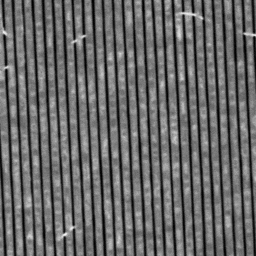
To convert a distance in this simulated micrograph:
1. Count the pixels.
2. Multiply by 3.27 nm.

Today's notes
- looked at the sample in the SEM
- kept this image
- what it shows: parallel lines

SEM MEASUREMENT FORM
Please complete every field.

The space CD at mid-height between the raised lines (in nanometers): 8.6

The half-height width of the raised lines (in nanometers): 23.7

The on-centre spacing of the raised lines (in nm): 32.7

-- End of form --